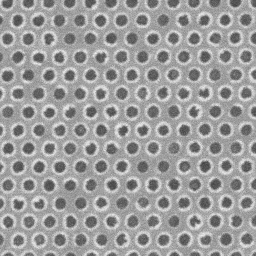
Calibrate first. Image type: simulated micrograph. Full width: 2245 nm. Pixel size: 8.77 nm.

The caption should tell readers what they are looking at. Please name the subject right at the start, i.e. a regular array of holes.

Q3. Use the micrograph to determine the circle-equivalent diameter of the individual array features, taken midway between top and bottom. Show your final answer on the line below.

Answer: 103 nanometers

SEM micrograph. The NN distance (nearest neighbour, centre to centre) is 178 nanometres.